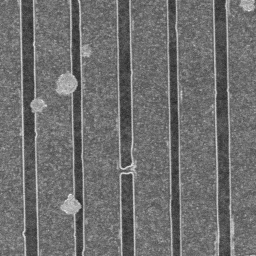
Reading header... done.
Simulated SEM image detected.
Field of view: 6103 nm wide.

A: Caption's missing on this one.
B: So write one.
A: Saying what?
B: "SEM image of parallel lines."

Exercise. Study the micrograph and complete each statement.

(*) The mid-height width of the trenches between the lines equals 295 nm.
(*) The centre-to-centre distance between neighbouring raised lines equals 1130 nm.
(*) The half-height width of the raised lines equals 885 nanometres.